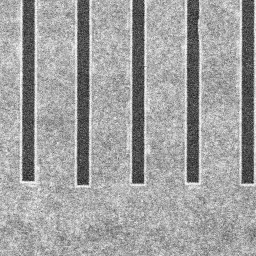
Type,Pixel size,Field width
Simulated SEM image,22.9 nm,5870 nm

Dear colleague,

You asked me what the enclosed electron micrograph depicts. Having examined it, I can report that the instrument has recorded parallel lines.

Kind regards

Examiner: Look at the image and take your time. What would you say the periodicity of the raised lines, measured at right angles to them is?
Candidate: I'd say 1250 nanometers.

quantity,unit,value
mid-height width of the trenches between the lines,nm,353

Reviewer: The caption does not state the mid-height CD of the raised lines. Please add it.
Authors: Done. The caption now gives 0.906 um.